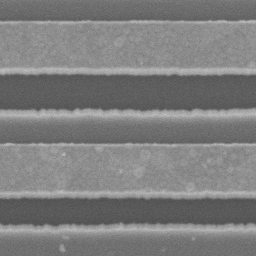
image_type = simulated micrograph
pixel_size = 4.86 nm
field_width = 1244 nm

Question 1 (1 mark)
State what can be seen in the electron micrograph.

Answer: lines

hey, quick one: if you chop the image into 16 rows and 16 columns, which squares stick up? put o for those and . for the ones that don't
oooooooooooooooo
oooooooooooooooo
oooooooooooooooo
oooooooooooooooo
................
................
................
oooooooooooooooo
oooooooooooooooo
oooooooooooooooo
oooooooooooooooo
oooooooooooooooo
................
................
oooooooooooooooo
oooooooooooooooo